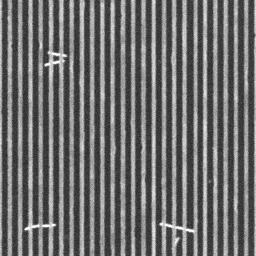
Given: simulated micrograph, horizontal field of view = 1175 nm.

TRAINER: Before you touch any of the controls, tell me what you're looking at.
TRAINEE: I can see parallel lines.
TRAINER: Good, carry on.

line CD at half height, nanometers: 14.9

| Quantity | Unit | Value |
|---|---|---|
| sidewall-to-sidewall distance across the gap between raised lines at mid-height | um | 0.0339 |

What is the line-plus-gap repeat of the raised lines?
0.0473 um